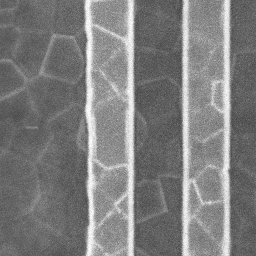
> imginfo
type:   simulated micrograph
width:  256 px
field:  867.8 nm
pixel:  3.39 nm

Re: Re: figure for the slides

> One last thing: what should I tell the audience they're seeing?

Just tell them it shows one or a few lines or trenches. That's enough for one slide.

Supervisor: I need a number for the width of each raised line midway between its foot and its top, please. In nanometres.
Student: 140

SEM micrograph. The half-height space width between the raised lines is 185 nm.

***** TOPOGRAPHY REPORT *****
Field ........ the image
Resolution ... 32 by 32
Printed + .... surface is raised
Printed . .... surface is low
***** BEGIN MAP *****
...........+++++.......+++++....
...........+++++.......+++++....
...........+++++.......+++++....
...........+++++.......+++++....
...........+++++.......+++++....
...........+++++.......+++++....
...........+++++.......+++++....
...........+++++.......+++++....
...........+++++.......+++++....
...........+++++.......+++++....
...........+++++.......+++++....
...........+++++.......+++++....
...........+++++.......+++++....
...........+++++.......+++++....
...........+++++.......+++++....
...........+++++.......+++++....
...........+++++.......+++++....
...........+++++.......+++++....
...........+++++.......+++++....
...........+++++.......+++++....
...........+++++.......+++++....
...........+++++.......+++++....
...........+++++.......+++++....
...........+++++.......+++++....
...........+++++.......+++++....
...........+++++.......+++++....
............++++.......+++++....
............++++.......+++++....
...........+++++.......+++++....
...........+++++.......+++++....
...........+++++.......+++++....
...........+++++.......+++++....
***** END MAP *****